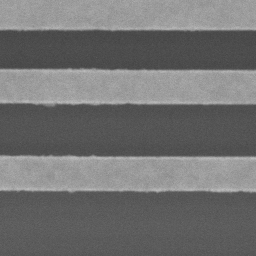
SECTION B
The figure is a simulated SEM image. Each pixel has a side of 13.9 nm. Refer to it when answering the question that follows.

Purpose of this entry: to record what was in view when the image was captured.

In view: lines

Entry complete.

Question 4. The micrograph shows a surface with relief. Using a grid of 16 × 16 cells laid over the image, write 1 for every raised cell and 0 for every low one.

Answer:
1111111111111111
1111111111111111
0000000000000000
0000000000000000
1111111111111111
1111111111111111
0000000000000000
0000000000000000
0000000000000000
0000000000000000
1111111111111111
1111111111111111
0000000000000000
0000000000000000
0000000000000000
0000000000000000